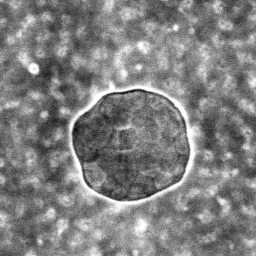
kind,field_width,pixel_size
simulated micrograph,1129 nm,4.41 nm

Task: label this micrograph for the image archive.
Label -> holes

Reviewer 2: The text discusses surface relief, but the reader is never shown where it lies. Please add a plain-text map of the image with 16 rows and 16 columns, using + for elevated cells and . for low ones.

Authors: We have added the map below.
++++++++++++++++
++++++++++++++++
++++++++++++++++
++++++++++++++++
++++++++++++++++
++++++++++++++++
++++++.....+++++
+++++.......++++
+++++.......++++
+++++.......++++
+++++.......++++
+++++......+++++
+++++++..+++++++
++++++++++++++++
++++++++++++++++
++++++++++++++++